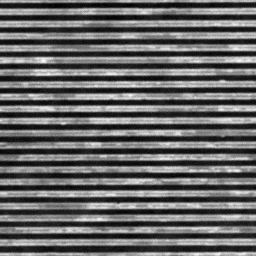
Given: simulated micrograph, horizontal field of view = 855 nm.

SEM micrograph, parallel lines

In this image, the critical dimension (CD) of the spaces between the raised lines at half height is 0.023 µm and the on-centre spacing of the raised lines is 40.6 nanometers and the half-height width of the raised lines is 20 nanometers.